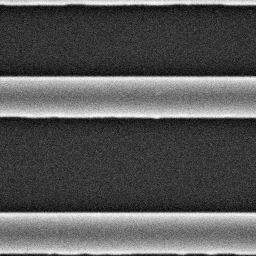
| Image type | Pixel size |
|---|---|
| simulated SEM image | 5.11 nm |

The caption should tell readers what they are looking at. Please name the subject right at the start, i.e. lines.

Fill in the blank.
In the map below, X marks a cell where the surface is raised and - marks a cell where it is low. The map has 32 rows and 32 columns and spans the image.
XXXXXXXXX---XXX----X--------XXXX
--------------------------------
--------------------------------
--------------------------------
--------------------------------
--------------------------------
--------------------------------
--------------------------------
--------------------------------
--------------------------------
XXXXXXXXXXXXXXXXXXXXXXXXXXXXXXXX
XXXXXXXXXXXXXXXXXXXXXXXXXXXXXXXX
XXXXXXXXXXXXXXXXXXXXXXXXXXXXXXXX
XXXXXXXXXXXXXXXXXXXXXXXXXXXXXXXX
---XXXXXXXXXX-X-XXXXXXXXXXXXXXXX
--------------------------------
--------------------------------
--------------------------------
--------------------------------
--------------------------------
--------------------------------
--------------------------------
--------------------------------
--------------------------------
--------------------------------
--------------------------------
--------------------------------
XXXXXXXXXXXXXXXXXXXXXXXXXXXXXXXX
XXXXXXXXXXXXXXXXXXXXXXXXXXXXXXXX
XXXXXXXXXXXXXXXXXXXXXXXXXXXXXXXX
XXXXXXXXXXXXXXXXXXXXXXXXXXXXXXXX
XXXXXXXXXXXXXXXXXXXXXXXXXXXXXXXX